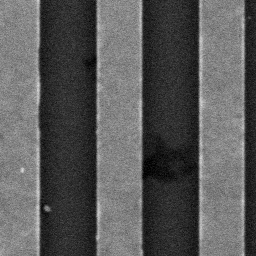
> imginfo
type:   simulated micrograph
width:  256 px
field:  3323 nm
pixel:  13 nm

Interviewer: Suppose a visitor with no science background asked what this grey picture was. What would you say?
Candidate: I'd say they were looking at lines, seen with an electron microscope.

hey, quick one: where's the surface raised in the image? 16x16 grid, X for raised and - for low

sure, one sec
XX----XXX----XX-
XX----XXX----XX-
XX----XXX----XX-
XX----XXX----XX-
XX----XXX----XX-
XX----XXX----XX-
XX----XXX----XX-
XX----XXX----XX-
XX----XXX----XX-
XX----XXX----XX-
XX----XXX----XX-
XX----XXX----XX-
XX----XXX----XX-
XX----XXX----XX-
XX----XXX----XX-
XX----XXX----XX-